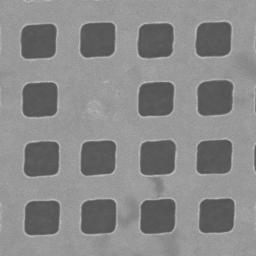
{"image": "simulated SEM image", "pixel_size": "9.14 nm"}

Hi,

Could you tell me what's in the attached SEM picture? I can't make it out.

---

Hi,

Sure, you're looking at a regular array of holes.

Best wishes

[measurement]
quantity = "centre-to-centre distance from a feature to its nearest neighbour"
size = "57.9 px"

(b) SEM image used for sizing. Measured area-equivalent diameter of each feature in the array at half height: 347 nm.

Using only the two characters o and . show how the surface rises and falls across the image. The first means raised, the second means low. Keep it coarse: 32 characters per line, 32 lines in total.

oooooooooooooooooooooooooooooooo
oooooooooooooooooooooooooooooooo
oooooooooooooooooooooooooooooooo
ooo....ooo....oooo....ooo....ooo
ooo....ooo....ooo.....ooo....ooo
ooo....ooo....ooo.....oo.....ooo
ooo....ooo....ooo....oooo....ooo
oooooooooooooooooooooooooooooooo
oooooooooooooooooooooooooooooooo
oooooooooooooooooooooooooooooooo
ooo....ooooooooooo...oooo....ooo
ooo....oooooooooo.....ooo....ooo
ooo....oooooooooo.....ooo....ooo
ooo....oooooooooo.....ooo....ooo
ooo...oooooooooooo.ooooooooooooo
oooooooooooooooooooooooooooooooo
oooooooooooooooooooooooooooooooo
ooooooooooooooooooooooooooo.oooo
ooo....ooo.....ooo....ooo....ooo
ooo....ooo....oooo....ooo....ooo
ooo....ooo....oooo....ooo....ooo
ooo....ooo....oooo...oooo...oooo
oooooooooooooooooooooooooooooooo
oooooooooooooooooooooooooooooooo
oooooooooooooooooooooooooooooooo
oooo...ooo....oooo....ooo....ooo
ooo.....oo.....ooo....ooo....ooo
ooo....ooo....ooo.....ooo....ooo
ooo....ooo....oooo....ooo....ooo
oooooooooooooooooooooooooooooooo
oooooooooooooooooooooooooooooooo
oooooooooooooooooooooooooooooooo